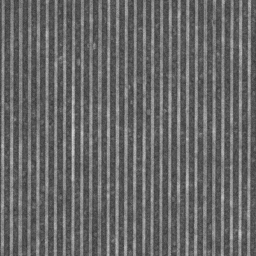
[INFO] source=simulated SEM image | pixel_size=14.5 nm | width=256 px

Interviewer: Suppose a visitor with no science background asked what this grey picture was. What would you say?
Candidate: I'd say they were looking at parallel lines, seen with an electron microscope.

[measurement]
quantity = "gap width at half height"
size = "6.25 px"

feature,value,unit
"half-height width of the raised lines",0.0363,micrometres